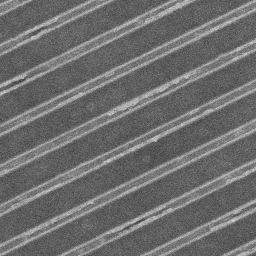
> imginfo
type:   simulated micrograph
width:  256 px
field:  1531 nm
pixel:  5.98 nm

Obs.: parallel lines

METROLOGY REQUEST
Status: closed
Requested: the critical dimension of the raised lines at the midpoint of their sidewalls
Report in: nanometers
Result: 51.6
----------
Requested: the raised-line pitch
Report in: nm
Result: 215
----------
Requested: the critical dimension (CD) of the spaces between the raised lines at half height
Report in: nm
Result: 160